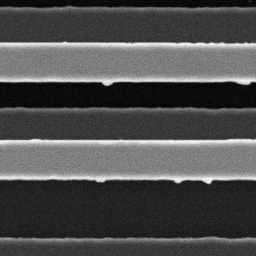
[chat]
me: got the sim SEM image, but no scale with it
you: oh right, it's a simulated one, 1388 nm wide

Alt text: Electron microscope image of lines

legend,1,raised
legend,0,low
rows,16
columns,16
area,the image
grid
1111111111111111
1111111111111111
1111111111111111
1111111111111111
1111111111111111
0000000000000000
0000000000000000
1111111111111111
1111111111111111
1111111111111111
1111111111111111
0000000000000000
0000000000000000
0000000000000000
0000000000000000
1111111111111111